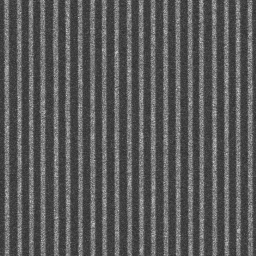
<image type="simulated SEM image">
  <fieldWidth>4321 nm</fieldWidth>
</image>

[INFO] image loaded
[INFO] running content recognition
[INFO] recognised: parallel lines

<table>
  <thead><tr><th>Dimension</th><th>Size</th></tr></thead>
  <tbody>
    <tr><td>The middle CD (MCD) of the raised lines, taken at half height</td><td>71.7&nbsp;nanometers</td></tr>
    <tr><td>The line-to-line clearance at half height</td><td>144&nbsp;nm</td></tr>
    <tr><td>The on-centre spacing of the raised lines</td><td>205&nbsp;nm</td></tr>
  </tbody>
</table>